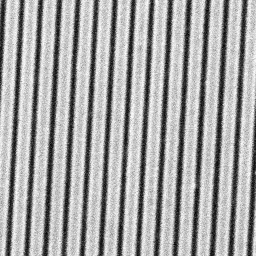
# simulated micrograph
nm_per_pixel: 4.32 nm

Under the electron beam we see parallel lines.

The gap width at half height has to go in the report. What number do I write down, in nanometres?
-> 32.9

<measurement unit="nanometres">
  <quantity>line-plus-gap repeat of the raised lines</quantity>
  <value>80.2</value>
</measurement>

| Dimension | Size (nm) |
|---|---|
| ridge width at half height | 47.5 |